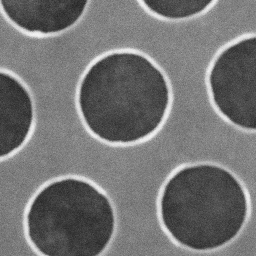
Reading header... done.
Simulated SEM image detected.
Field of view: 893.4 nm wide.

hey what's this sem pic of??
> holes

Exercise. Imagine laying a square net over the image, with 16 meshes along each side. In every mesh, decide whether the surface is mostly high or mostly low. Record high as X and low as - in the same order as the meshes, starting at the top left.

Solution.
-----XXXX----XXX
X---XXXXXXXXXXXX
XXXXXXXXXXXXXXX-
XXXXXXX--XXXXX--
XXXXXX----XXX---
-XXXX-----XXX---
--XXX-----XXXX--
--XXX-----XXXX--
--XXXX---XXXXXXX
-XXXXXXXXXXXXXXX
XXXXXXXXXXXX--XX
XXX--XXXXX-----X
XX-----XXX-----X
XX-----XXX-----X
XX-----XXXX----X
XX----XXXXXX-XXX